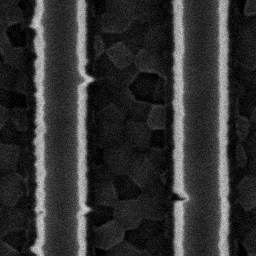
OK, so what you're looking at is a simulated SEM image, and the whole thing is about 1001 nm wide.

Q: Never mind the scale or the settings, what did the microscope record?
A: one or a few lines or trenches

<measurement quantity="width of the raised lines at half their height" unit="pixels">46.5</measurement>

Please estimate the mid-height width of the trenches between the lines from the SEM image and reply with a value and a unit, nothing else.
367 nanometres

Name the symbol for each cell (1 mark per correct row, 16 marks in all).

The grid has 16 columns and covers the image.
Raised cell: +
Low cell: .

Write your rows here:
..+++......+++..
..+++......+++..
..+++......+++..
..+++......+++..
..+++......+++..
..+++......+++..
..+++......+++..
..+++......+++..
..+++......+++..
..+++......+++..
..+++......+++..
..+++......+++..
..+++......+++..
..+++......+++..
..+++......+++..
..+++......+++..